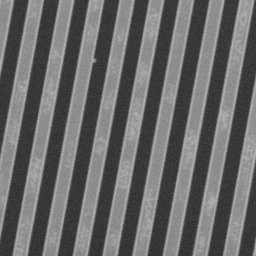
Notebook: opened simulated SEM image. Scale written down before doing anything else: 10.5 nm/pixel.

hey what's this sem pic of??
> parallel lines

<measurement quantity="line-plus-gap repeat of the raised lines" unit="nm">311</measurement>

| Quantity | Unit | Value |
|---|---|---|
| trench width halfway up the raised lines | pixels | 17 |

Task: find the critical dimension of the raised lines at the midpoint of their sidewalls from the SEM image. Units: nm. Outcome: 129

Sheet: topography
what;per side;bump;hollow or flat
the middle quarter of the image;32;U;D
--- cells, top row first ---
DDDDUUUDDDDUUUDDDDDUUUDDDDUUUDDD
DDDDUUUDDDDUUUDDDDUUUDDDDDUUUDDD
DDDUUUDDDDDUUUDDDDUUUDDDDDUUUDDD
DDDUUUDDDDDUUUDDDDUUUDDDDDUUUDDD
DDDUUUDDDDUUUDDDDDUUUDDDDUUUDDDD
DDDUUUDDDDUUUDDDDDUUUDDDDUUUDDDD
DDDUUUDDDDUUUDDDDUUUDDDDDUUUDDDD
DDUUUDDDDDUUUDDDDUUUDDDDDUUUDDDD
DDUUUDDDDDUUUDDDDUUUDDDDDUUUDDDD
DDUUUDDDDDUUUDDDDUUUDDDDDUUUDDDD
DDUUUDDDDUUUDDDDDUUUDDDDUUUDDDDD
DDUUUDDDDUUUDDDDDUUUDDDDUUUDDDDD
DDUUUDDDDUUUDDDDUUUDDDDDUUUDDDDU
DUUUDDDDDUUUDDDDUUUDDDDDUUUDDDDU
DUUUDDDDDUUUDDDDUUUDDDDDUUUDDDDU
DUUUDDDDUUUDDDDDUUUDDDDUUUDDDDDU
DUUUDDDDUUUDDDDDUUUDDDDUUUDDDDDU
DUUUDDDDUUUDDDDUUUDDDDDUUUDDDDDU
UUUDDDDDUUUDDDDUUUDDDDDUUUDDDDUU
UUUDDDDDUUUDDDDUUUDDDDDUUUDDDDUU
UUUDDDDUUUDDDDDUUUDDDDUUUUDDDDUU
UUUDDDDUUUDDDDDUUUDDDDUUUDDDDDUU
UUUDDDDUUUDDDDDUUUDDDDUUUDDDDDUU
UUUDDDDUUUDDDDUUUDDDDDUUUDDDDUUU
UUDDDDDUUUDDDDUUUDDDDDUUUDDDDUUU
UUDDDDDUUUDDDDUUUDDDDDUUUDDDDUUU
UUDDDDUUUDDDDDUUUDDDDUUUDDDDDUUU
UUDDDDUUUDDDDDUUUDDDDUUUDDDDDUUU
UUDDDDUUUDDDDUUUDDDDDUUUDDDDDUUU
UDDDDDUUUDDDDUUUUDDDDUUUDDDDUUUD
UDDDDDUUUDDDDUUUDDDDDUUUDDDDUUUD
UDDDDUUUDDDDDUUUDDDDDUUUDDDDUUUD